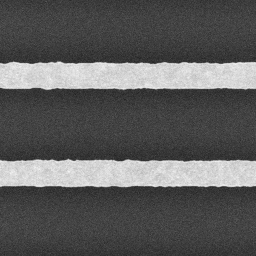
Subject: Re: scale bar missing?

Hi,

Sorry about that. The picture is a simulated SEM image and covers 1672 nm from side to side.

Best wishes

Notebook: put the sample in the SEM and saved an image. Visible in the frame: lines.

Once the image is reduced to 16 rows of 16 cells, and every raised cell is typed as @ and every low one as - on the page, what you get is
----------------
----------------
----------------
----------------
@@@@@@@@@@@@@@@@
@@@@@@@@@@@@@@@@
----------------
----------------
----------------
----------------
@@@@@@@@@@@@@@@@
@@@@@@@@@@@@@@@@
----------------
----------------
----------------
----------------